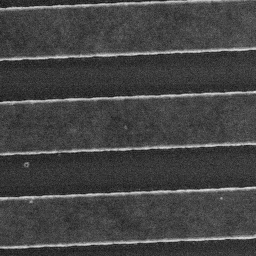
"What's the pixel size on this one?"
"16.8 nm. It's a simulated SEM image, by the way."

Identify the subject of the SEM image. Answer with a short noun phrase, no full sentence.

lines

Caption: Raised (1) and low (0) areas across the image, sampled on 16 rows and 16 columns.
0111111111111111
1111111111111111
1111111111111111
1111110000000000
0000000000000000
0000000000000000
1111111111111111
1111111111111111
1111111111111111
1111000000000000
0000000000000000
0000000000000000
1111111111111111
1111111111111111
1111111111111111
0000000000000000